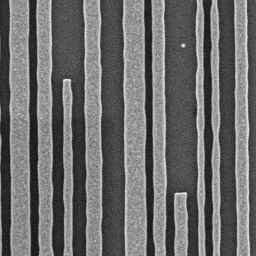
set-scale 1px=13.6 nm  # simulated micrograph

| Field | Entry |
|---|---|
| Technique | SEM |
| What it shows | groups of lines, slits or small figures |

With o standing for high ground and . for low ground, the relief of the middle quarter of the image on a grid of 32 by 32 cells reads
.....oooo......ooooo..ooo.......
.....oooo......ooooo..ooo.......
.....oooo......ooooo..ooo.......
......ooo......ooooo..ooo.......
o....oooo......ooooo..ooo.......
o....oooo......ooooo..ooo.......
oo...oooo......ooooo..ooo.......
oo....ooo......ooooo..ooo.......
oo....ooo......ooooo..ooo.......
oo...oooo......ooooo..ooo.......
oo...oooo......ooooo..ooo.......
oo...oooo......ooooo..ooo.......
oo...oooo......ooooo..ooo.......
oo....ooo......ooooo..ooo.......
oo....ooo......ooooo..ooo.......
oo....ooo......ooooo..ooo.......
oo....ooo......ooooo..ooo.......
oo....ooo......ooooo..ooo.......
oo....ooo......ooooo..ooo.......
oo....ooo......ooooo..ooo.......
oo....ooo......ooooo..ooo.......
oo....ooo......ooooo..ooo.......
oo....ooo......ooooo..ooo.......
oo....ooo......ooooo..ooo.......
oo....ooo......ooooo...oo.......
oo....ooo......ooooo...oo.......
oo....ooo......ooooo...oo.......
oo....ooo......ooooo..ooo.......
oo....ooo.......oooo..ooo.......
oo....ooo.......oooo..ooo.......
oo....ooo......ooooo...oo.......
oo....ooo......ooooo...oo.......